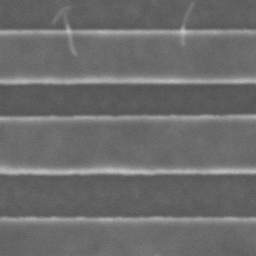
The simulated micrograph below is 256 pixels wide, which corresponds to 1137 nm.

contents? lines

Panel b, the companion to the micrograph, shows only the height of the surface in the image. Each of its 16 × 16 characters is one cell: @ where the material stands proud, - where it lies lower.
----------------
----------------
@@@@@@@@@@@@@@@@
@@@@@@@@@@@@@@@@
@@@@@@@@@@@@@@@@
----------------
----------------
@@@@@@@@@@@@@@@@
@@@@@@@@@@@@@@@@
@@@@@@@@@@@@@@@@
@@@@@@@@@@@@@@@@
----------------
----------------
----------------
@@@@@@@@@@@@@@@@
@@@@@@@@@@@@@@@@